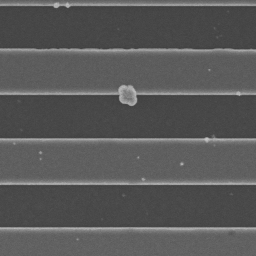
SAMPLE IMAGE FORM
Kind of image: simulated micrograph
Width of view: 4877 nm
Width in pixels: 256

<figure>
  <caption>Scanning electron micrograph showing lines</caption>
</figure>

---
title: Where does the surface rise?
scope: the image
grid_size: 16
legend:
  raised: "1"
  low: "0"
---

0000000000000000
0000000000000000
0000000000000000
1111111111111111
1111111111111111
1111111111111111
0000000000000000
0000000000000000
0000000000000000
1111111111111111
1111111111111111
1111111111111111
0000000000000000
0000000000000000
1111111111111111
1111111111111111